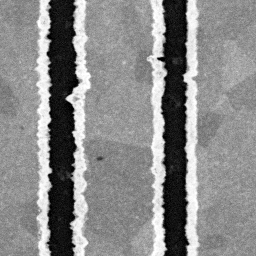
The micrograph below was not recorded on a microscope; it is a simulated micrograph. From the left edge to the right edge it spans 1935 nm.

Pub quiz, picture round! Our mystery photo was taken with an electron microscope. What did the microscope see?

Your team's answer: one or a few lines or trenches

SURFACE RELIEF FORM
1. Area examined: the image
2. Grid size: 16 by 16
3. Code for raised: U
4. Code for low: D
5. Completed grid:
UUUDDUUUUUDDUUUU
UUUDDUUUUUDDUUUU
UUUDDUUUUUDDUUUU
UUUDDUUUUUDDUUUU
UUUDDUUUUUDDUUUU
UUUDDUUUUUDDUUUU
UUUDDUUUUUDDUUUU
UUUDDUUUUUDDUUUU
UUUDDUUUUUDDUUUU
UUUDDUUUUUDDUUUU
UUUDDUUUUUDDUUUU
UUUDDUUUUUDDUUUU
UUUDDUUUUUDDUUUU
UUUDDUUUUUDDUUUU
UUUDDUUUUUDDUUUU
UUUDDUUUUUDDUUUU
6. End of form